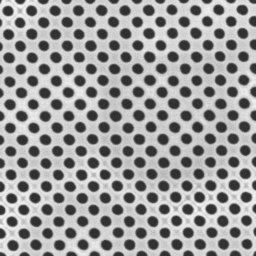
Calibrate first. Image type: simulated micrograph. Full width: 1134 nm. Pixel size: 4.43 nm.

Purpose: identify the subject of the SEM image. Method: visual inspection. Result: a regular array of holes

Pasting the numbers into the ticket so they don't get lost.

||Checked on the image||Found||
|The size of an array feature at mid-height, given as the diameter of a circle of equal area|49.5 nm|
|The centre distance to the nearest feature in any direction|71.9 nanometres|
